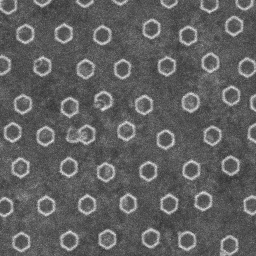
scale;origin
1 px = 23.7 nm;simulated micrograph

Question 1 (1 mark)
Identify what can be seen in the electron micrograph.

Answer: a regular array of raised bodies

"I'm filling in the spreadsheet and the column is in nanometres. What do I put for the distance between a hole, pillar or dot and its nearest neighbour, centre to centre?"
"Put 843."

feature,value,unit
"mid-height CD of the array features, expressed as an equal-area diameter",400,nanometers